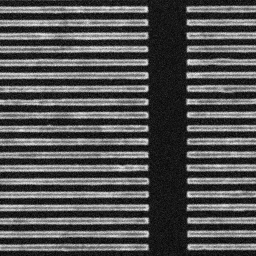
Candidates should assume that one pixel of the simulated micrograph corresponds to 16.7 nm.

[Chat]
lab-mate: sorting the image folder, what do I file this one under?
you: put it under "parallel lines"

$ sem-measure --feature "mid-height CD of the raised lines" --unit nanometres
75.3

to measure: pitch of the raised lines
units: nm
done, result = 221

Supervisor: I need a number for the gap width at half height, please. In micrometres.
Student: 0.151